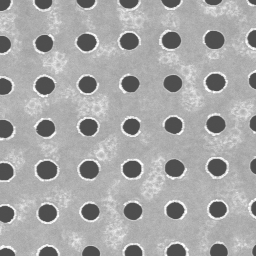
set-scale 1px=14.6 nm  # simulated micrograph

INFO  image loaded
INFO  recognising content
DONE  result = a regular array of holes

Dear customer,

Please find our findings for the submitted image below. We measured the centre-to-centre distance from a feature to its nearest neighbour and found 616 nanometres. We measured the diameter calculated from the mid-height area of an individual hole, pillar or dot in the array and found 265 nm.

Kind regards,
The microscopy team